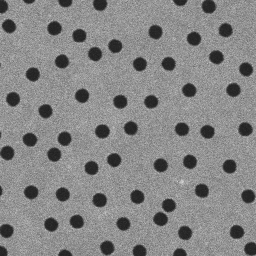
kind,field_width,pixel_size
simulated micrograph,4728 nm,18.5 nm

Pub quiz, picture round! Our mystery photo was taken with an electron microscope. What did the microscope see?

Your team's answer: a regular array of holes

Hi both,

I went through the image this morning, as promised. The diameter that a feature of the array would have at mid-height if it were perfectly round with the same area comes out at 266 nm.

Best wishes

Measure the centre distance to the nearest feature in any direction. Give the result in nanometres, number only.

536